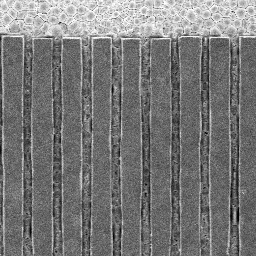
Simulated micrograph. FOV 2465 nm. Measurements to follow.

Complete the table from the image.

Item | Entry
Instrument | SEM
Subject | parallel lines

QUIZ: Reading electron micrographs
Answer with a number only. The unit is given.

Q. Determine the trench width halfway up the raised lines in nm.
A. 92.7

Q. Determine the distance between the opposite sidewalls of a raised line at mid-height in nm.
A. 195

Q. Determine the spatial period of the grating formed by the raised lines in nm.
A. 284